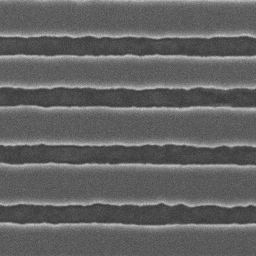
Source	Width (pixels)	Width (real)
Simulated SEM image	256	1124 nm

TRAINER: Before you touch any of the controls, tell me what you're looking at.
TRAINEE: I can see lines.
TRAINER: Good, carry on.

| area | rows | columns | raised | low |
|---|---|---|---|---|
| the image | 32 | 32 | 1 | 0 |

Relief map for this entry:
11111111111111111111111111111111
11111111111111111111111111111111
11111111111111111111111111111111
11111111111111111111111111111111
11111011111111111111111111111101
00000000000000000000000000000000
00000000000000000000000000000000
11111111111111111111111111111111
11111111111111111111111111111111
11111111111111111111111111111111
11111111111111111111111111111111
00000000000000000000000000000000
00000000000000000000000000000000
11111111111111111111111111111111
11111111111111111111111111111111
11111111111111111111111111111111
11111111111111111111111111111111
11111111111111111111111111111111
00000000000000000000000000000000
00000000000000000000000000000000
10011111101111111110000000000000
11111111111111111111111111111111
11111111111111111111111111111111
11111111111111111111111111111111
11111111111111111111111111111111
11101111111001111111010111111111
00000000000000000000000000000000
00000000000000000000000000000000
11111111111111111111111111111111
11111111111111111111111111111111
11111111111111111111111111111111
11111111111111111111111111111111